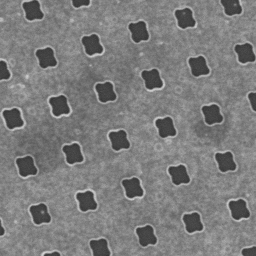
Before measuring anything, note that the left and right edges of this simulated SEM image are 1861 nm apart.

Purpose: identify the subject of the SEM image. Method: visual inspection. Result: a regular array of holes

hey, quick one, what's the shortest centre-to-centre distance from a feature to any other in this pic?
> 48 pixels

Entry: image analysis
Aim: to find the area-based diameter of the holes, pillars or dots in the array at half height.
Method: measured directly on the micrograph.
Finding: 21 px